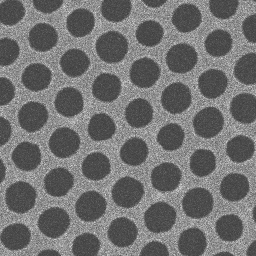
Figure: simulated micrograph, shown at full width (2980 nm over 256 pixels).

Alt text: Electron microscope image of a regular array of holes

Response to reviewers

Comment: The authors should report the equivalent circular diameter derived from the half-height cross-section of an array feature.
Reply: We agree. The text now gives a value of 351 nanometres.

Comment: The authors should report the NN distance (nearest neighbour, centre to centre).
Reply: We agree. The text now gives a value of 460 nanometers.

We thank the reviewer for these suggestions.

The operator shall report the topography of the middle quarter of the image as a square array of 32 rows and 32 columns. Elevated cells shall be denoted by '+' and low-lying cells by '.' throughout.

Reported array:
......+++++++++++.......++......
......++++++++++........++......
.....++++...++++........++++++++
++++++++......++........++++++++
+++++++.......+++......+++++.+++
+++++++.......++++....++++.....+
....+++.......+++++++++++.......
.....++.......++++++++++........
.....+++.....+++++.+++++........
.....++++...++++.....+++........
.....+++++++++++......+++......+
.....++++++++++.......+++......+
....++++...++++.......+++++.++++
+++++++.....+++.......++++++++++
++++++.......+++......++++++++++
++++++.......++++....++++....+++
...+++.......+++++++++++......++
...+++.......++++++++++.......++
....+++.....+++++..++++.......++
....+++++++++++.....+++.......++
....++++++++++.......+++.....+++
....++++++++++.......++++...++++
...+++....++++.......+++++++++++
.++++......+++.......++++++++++.
+++++.......+++.....+++++.+++++.
++++........+++++.+++++.....+++.
.+++........++++++++++.......+++
..+++......+++++++++++.......+++
...+++....++++....++++.......+++
...++++++++++......+++.......+++
..++++++++++........++.......+++
.+++++++++++........+++....++++.